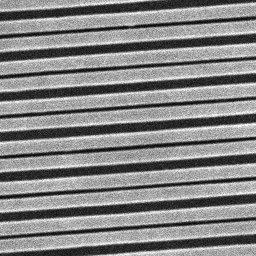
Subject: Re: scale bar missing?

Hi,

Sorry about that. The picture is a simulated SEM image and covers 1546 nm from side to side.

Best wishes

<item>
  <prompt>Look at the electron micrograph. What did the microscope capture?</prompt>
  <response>parallel lines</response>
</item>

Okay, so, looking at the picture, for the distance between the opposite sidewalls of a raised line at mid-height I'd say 78.3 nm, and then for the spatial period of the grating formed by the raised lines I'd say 119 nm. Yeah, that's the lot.